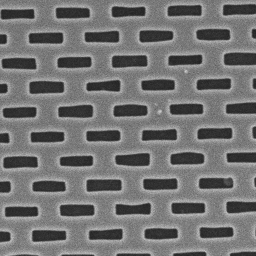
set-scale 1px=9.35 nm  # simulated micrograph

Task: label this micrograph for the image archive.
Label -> groups of lines, slits or small figures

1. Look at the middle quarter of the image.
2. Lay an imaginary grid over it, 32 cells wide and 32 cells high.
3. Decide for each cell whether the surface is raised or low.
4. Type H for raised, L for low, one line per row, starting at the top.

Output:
LLLLLLLHHHHHLLLLLLLLLHHHHHLLHHHH
HHHHHHHHHHHHHHHHHHHHHHHHHHHHHHHH
HHHHHHHHHHHHHHHHHHHHHHHHHHHHHHHH
HHHHHHHHHHHHHHHHHHHHHHHHHHHHHHHH
HHHHHHLLLLLLLLHHHHHLLLLLLLLLHHHH
HHHHHLLLLLLLLLHHHHHLLLLLLLLLHHHH
HHHHHHLLLLLLLLHHHHHLLLLLLLLHHHHH
HHHHHHHHHHHHHHHHHHHHHHHHHHHHHHHH
HHHHHHHHHHHHHHHHHHHHHHHHHHHHHHHH
HHHHHHHHHHHHHHHHHHHHHHHHHHHHHHHH
LLLLLLLHHHHHHLLLLLLLLHHHHHLLLLLL
LLLLLLLLHHHHLLLLLLLLLHHHHHLLLLLL
LLLLLLLHHHHHLLLLLLLLLHHHHHHLLLLL
HHHHLHHHHHHHHHHHHHHHHHHHHHHHHHHH
HHHHHHHHHHHHHHHHHHHHHHHHHHHHHHHH
HHHHHHHHHHHHHHHHHHHHHHHHHHHHHHHH
HHHHHHHHHHLLLHHHHHHHLLLLLLLLHHHH
HHHHHLLLLLLLLLHHHHHLLLLLLLLLHHHH
HHHHHLLLLLLLLLHHHHHLLLLLLLLLHHHH
HHHHHHHHHHHHHHHHHHHHHHHHHHHHHHHH
HHHHHHHHHHHHHHHHHHHHHHHHHHHHHHHH
HHHHHHHHHHHHHHHHHHHHHHHHHHHHHHHH
HHHHHHHHHHHHHHHHLLLLLHHHHHHLLLLL
LLLLLLLHHHHHHLLLLLLLLLHHHHHLLLLL
LLLLLLLLHHHHHLLLLLLLLLHHHHHLLLLL
LLLLLLLHHHHHHHHHLLLLLHHHHHHHHHHH
HHHHHHHHHHHHHHHHHHHHHHHHHHHHHHHH
HHHHHHHHHHHHHHHHHHHHHHHHHHHHHHHH
HHHHHHHHHHHHHHHHHHHHHHHHHHHLHHHH
HHHHHLLLLLLLLLHHHHHHLLLLLLLLHHHH
HHHHHLLLLLLLLLLHHHHHLLLLLLLLHHHH
HHHHHHLLLLLLLLHHHHHHHLLLLHHHHHHH